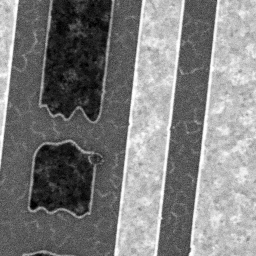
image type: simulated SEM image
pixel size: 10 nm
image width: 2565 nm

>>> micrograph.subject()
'one or a few lines or trenches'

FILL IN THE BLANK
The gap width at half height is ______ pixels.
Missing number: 33.1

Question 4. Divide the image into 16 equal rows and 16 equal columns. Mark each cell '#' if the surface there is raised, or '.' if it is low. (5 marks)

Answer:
#..####..##...##
#..####..##..###
#..####..##..###
#..####..##..###
#..####.###..###
#..###..###..###
...###..###..###
........###..###
........###..###
..###...##...###
..####..##...###
..####..##..####
..####..##..####
.......###..####
.......###..####
.......###..####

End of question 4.